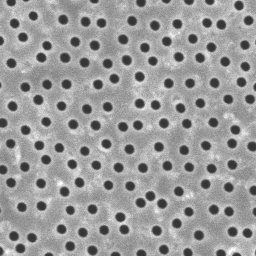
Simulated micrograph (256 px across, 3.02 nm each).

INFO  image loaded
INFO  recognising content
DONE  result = a regular array of holes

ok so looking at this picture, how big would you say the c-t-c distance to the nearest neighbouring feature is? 18.8 px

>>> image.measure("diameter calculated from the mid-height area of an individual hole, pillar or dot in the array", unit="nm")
27.9